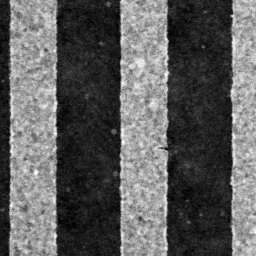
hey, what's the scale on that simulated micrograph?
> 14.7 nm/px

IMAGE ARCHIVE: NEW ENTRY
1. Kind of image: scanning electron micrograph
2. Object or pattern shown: one or a few lines or trenches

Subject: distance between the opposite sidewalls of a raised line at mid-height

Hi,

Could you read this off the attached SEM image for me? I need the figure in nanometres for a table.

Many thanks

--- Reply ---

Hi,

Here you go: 594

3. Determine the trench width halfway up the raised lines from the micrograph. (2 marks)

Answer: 957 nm